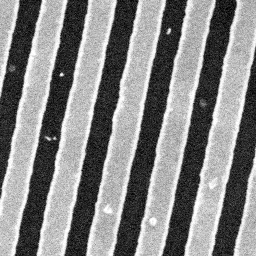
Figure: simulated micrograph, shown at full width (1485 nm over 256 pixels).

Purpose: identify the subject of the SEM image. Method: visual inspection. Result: lines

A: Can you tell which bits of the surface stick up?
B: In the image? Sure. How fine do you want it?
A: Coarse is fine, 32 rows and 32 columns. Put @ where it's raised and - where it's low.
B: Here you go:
@@---@@@---@@@---@@@@--@@@@---@@
@@---@@@---@@@---@@@---@@@@---@@
@@---@@@---@@@---@@@---@@@---@@@
@@--@@@@---@@@---@@@---@@@---@@@
@---@@@---@@@@--@@@@---@@@---@@@
@---@@@---@@@---@@@@--@@@@---@@@
@---@@@---@@@---@@@---@@@---@@@@
@---@@@---@@@---@@@---@@@---@@@@
@--@@@@--@@@@---@@@---@@@---@@@-
@--@@@---@@@@--@@@@--@@@@---@@@-
---@@@---@@@---@@@---@@@@--@@@@-
---@@@---@@@---@@@---@@@---@@@@-
---@@@---@@@---@@@---@@@---@@@@-
--@@@@--@@@@---@@@---@@@---@@@--
--@@@---@@@@--@@@@---@@@---@@@--
--@@@---@@@---@@@@--@@@@---@@@--
--@@@---@@@---@@@---@@@---@@@@--
--@@@---@@@---@@@---@@@---@@@---
-@@@@--@@@@---@@@---@@@---@@@---
-@@@---@@@@--@@@@---@@@---@@@---
-@@@---@@@---@@@---@@@@--@@@@---
-@@@---@@@---@@@---@@@---@@@@--@
-@@@---@@@---@@@---@@@---@@@---@
@@@---@@@@--@@@@---@@@---@@@---@
@@@---@@@---@@@@--@@@@---@@@---@
@@@---@@@---@@@---@@@@--@@@@---@
@@@---@@@---@@@---@@@---@@@@---@
@@@--@@@@---@@@---@@@---@@@---@@
@@---@@@@--@@@@---@@@---@@@---@@
@@---@@@---@@@@--@@@@---@@@---@@
@@---@@@---@@@---@@@@--@@@@--@@@
@@---@@@---@@@---@@@---@@@---@@@